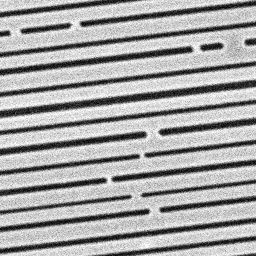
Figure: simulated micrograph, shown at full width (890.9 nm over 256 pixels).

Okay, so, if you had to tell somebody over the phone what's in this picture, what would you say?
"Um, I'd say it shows parallel lines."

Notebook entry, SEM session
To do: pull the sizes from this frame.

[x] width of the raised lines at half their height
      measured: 44.1 nanometres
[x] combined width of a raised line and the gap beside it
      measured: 67.9 nm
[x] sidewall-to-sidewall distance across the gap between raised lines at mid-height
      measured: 20.3 nm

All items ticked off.